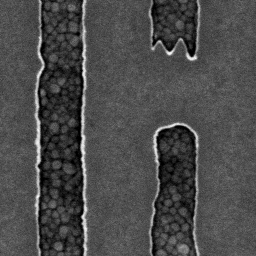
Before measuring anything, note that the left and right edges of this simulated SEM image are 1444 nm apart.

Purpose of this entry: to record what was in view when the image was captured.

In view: one or a few lines or trenches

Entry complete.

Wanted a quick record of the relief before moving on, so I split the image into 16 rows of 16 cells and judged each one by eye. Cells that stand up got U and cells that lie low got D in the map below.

UUUDDUUUUDDDUUUU
UUUDDUUUUDDDUUUU
UUUDDUUUUUDDUUUU
UUUDDUUUUUUUUUUU
UUUDDUUUUUUUUUUU
UUDDDUUUUUUUUUUU
UUDDDUUUUUUUUUUU
UUDDDUUUUUUUUUUU
UUDDDUUUUUDDUUUU
UUUDDUUUUUDDUUUU
UUDDDUUUUUDDUUUU
UUDDDUUUUUDDUUUU
UUDDDUUUUUDDUUUU
UUDDDUUUUUDDUUUU
UUDDDUUUUDDDUUUU
UUDDDUUUUUDDUUUU